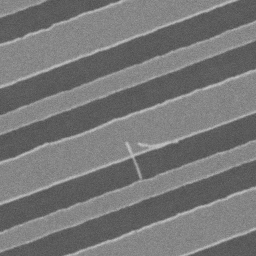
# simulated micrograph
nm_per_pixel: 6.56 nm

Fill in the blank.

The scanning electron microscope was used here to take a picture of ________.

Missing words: lines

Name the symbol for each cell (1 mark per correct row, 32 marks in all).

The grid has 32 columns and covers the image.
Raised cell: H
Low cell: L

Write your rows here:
HHHHHLLLLLLLLLHHHHHHHHHHHHHHLLLL
HHLLLLLLLLLHHHHHHHHHHHHHHHLLLLLL
LLLLLLLLLHHHHHHHHHHHHHHLLLLLLLLL
LLLLLLHHHHHHHHHHHHHHLLLLLLLLLLHH
LLLHHHHHHHHHHHHHHLLLLLLLLLLHHHHH
HHHHHHHHHHHHHHHLLLLLLLLLHHHHHHHL
HHHHHHHHHHHHLLLLLLLLLHHHHHHHLLLL
HHHHHHHHHHLLLLLLLLLHHHHHHLLLLLLL
HHHHHHHLLLLLLLLLHHHHHHHLLLLLLLLL
HHHHLLLLLLLLLHHHHHHHLLLLLLLLLLHH
HLLLLLLLLLLHHHHHHLLLLLLLLLLHHHHH
LLLLLLLLHHHHHHHLLLLLLLLLHHHHHHHH
LLLLLHHHHHHHLLLLLLLLLHHHHHHHHHHH
LLLHHHHHHLLLLLLLLLLHHHHHHHHHHHHH
HHHHHHLLLLLLLLLLHHHHHHHHHHHHHHHL
HHHHLLLLLLLLLHHHHHHHHHHHHHHHLLLL
HLLLLLLLLLLHHHHHHHHHHHHHHLLLLLLL
LLLLLLLLHHHHHHHHHHHHHHLLLLLLLLLL
LLLLHHHHHHHHHHHHHHHHLLLLLLLLLHHH
LLHHHHHHHHHHHHHHHLLLLLLLLLHHHHHH
HHHHHHHHHHHHHHLLLLLLLLLLHHHHHHLL
HHHHHHHHHHHLLLLLLLLLLHHHHHHHLLLL
HHHHHHHHLLLLLLLLLLHHHHHHHLLLLLLL
HHHHHHLLLLLLLLLHHHHHHHLLLLLLLLLL
HHHLLLLLLLLLLHHHHHHLLLLLLLLLLHHH
LLLLLLLLLLHHHHHHHLLLLLLLLLHHHHHH
LLLLLLLHHHHHHHLLLLLLLLLHHHHHHHHH
LLLLHHHHHHHLLLLLLLLLHHHHHHHHHHHH
LLHHHHHHLLLLLLLLLLHHHHHHHHHHHHHH
HHHHHHLLLLLLLLLHHHHHHHHHHHHHHHLL
HHHLLLLLLLLLHHHHHHHHHHHHHHHLLLLL
LLLLLLLLLLHHHHHHHHHHHHHHLLLLLLLL